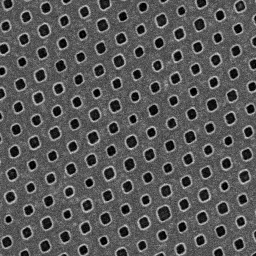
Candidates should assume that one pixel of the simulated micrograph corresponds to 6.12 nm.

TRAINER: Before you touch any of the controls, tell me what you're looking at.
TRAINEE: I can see a regular array of holes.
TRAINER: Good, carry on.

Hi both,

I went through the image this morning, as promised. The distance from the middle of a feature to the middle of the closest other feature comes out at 135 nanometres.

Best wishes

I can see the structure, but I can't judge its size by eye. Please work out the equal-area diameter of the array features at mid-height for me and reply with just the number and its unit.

61.7 nm